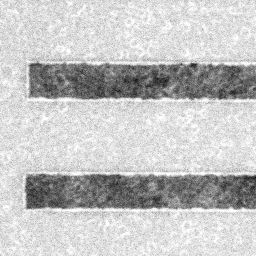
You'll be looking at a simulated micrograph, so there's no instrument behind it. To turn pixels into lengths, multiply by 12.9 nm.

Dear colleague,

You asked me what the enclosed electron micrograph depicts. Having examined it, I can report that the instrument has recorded one or a few lines or trenches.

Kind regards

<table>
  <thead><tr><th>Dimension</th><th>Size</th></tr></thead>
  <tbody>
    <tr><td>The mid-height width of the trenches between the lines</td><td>940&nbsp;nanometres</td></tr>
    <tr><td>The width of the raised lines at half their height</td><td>488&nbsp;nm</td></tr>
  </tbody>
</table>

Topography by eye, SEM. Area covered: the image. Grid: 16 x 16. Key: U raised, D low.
DDDDDDDDDDDDDDDD
DDDDDDDDDDDDDDDD
DDDDDDDDDDDDDDDD
DDDDDDDDDDDDDDDD
DDUUUUUUUUUUUUUU
DDUUUUUUUUUUUUUU
DDDDDDDDDDDDDDDD
DDDDDDDDDDDDDDDD
DDDDDDDDDDDDDDDD
DDDDDDDDDDDDDDDD
DDDDDDDDDDDDDDDD
DDUUUUUUUUUUUUUU
DDUUUUUUUUUUUUUU
DDDDDDDDDDDDDDDD
DDDDDDDDDDDDDDDD
DDDDDDDDDDDDDDDD